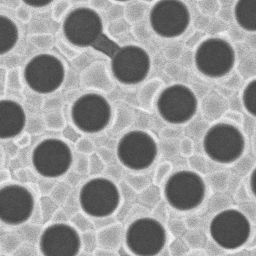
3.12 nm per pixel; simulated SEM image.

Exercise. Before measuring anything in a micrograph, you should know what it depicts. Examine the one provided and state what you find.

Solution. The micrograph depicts a regular array of holes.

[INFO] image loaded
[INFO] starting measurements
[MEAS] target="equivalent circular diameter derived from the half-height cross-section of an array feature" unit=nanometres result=119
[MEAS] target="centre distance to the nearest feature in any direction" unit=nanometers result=187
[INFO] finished